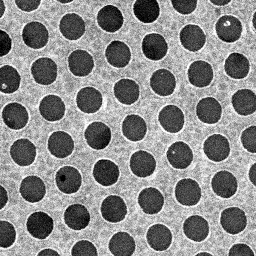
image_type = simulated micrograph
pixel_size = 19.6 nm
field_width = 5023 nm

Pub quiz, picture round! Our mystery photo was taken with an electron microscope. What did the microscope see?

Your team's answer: a regular array of holes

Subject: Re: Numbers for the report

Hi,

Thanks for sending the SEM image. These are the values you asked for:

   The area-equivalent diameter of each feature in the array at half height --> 543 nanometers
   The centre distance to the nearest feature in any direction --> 728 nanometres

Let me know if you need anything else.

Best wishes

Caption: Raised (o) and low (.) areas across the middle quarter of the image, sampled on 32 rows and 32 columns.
o.......oooo....ooooooooooooooo.
o......oooooooooooooooo...ooooo.
oo....oooooooooooooooo.....oooo.
ooooooooooooooo.oooooo......ooo.
ooooooooooooo.....ooo.......ooo.
oooooooooooo.......ooo......oooo
oooo....oooo.......ooo......oooo
ooo......ooo.......oooo....ooooo
ooo.......ooo......ooooooooooooo
ooo.......oooo....oooooooooooooo
ooo......oooooooooooooooo...oooo
.ooo.....ooooooooooooooo.....ooo
oooooo.ooooooooo..oooooo......oo
ooooooooooooooo.....ooo.......oo
ooooooo...ooooo.....oooo......oo
oooooo.....ooo.......ooo......oo
ooooo.......oo.......oooo....ooo
.oooo.......ooo......ooooooooooo
..ooo.......ooo.....oooooooooooo
...ooo......ooooo.oooooooooo..oo
...ooo.....ooooooooooooooo.....o
...ooooo..ooooooooo.oooooo......
..ooooooooooooooo.....ooo.......
oooooooooooooooo.......ooo......
oooooooo....oooo.......ooo......
..ooooo.......oo.......oooo....o
....ooo.......ooo......ooooooooo
....ooo.......ooo.....oooooooooo
.....oo.......ooooo.oo.ooooooo..
.....ooo.....ooooooooooooooo....
....oooooo..oooooooooooooooo....
....oooooooooooooooo....oooo....